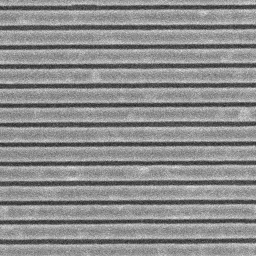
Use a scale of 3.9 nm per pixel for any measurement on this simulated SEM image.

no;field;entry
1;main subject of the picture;parallel lines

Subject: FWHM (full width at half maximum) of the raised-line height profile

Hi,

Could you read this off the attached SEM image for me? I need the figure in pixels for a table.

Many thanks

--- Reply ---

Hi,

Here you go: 14.6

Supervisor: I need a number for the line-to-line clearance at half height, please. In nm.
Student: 18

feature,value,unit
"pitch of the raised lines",75.9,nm